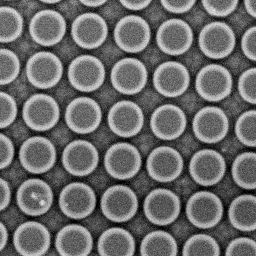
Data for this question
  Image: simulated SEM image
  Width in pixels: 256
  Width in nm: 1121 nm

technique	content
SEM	an array of small figures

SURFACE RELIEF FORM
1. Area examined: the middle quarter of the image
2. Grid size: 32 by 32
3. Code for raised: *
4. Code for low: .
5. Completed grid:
.*********...*******....******..
.*********..********...********.
.*********..*********..********.
.*********..*********.*********.
..********..********...********.
..*******...********...********.
....***......******....*******..
.........................****...
....**..........................
..******......***...............
.********...******.......***....
.********...*******....******...
*********..*********..********..
*********..*********..********..
.********..*********..********..
.*******...*********..********..
..*****.....*******...********..
.............*****.....******...
........................****....
..****..........................
.******.....*****...............
********...*******.....*****....
********..*********...*******...
*********.*********..********...
********..*********..********...
********..*********..*********..
.******....********..********...
..****......******....*******...
.............***.......*****....
................................
.*****..........................
*******....******......***......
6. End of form